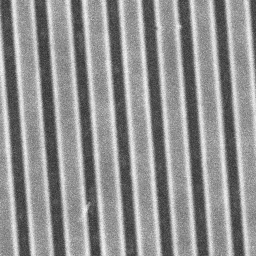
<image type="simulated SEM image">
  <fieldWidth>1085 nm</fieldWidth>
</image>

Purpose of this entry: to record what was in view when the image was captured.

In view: parallel lines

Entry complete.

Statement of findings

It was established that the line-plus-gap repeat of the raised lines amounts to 0.151 microns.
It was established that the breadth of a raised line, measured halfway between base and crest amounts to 90.4 nm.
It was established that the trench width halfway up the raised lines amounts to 0.0613 µm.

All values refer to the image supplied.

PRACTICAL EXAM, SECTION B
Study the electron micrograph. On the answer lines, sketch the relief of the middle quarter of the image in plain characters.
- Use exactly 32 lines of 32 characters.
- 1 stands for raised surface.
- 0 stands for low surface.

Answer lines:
11100011111100011111000011111000
11100011111100011111000011111000
11100011111100011111000011111000
11100011111100011111000011111000
11100011111100011111100011111100
11100001111100011111100011111100
11100001111100001111100001111100
11100001111100001111100001111100
11100001111100001111100001111100
11100001111100001111100001111100
11100001111100001111100001111100
11100001111100001111100001111100
11100001111100001111100001111100
11110001111110001111100001111100
11110001111110001111100001111100
11110001111110001111100001111100
11110001111110001111100001111100
11110001111110001111110001111110
11110000111110000111110001111110
11110000111110000111110000111110
11110000111110000111110000111110
11110000111110000111110000111110
11110000111110000111110000111110
11110000111110000111110000111110
11110000111110000111110000111110
11110000111110000111110000111110
11111000111111000111110000111110
11111000111111000111110000111110
11111000111111000111110000111110
11111000111111000111110000111110
11111000111111000111111000111111
11111000011111000011111000111111